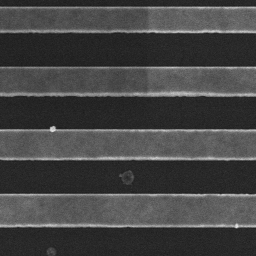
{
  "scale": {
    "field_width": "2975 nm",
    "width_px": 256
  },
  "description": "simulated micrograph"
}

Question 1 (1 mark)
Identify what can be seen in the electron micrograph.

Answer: lines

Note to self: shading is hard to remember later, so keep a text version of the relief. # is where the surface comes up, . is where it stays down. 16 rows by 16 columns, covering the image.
################
################
................
................
################
################
................
................
################
################
................
................
################
################
................
................